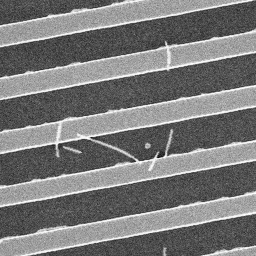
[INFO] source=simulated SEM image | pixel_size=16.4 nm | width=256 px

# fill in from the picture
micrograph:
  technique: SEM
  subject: lines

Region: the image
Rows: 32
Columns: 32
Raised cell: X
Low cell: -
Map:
---------------XXXXXXXXXXXXXX---
---------XXXXXXXXXXXXXXX--------
----XXXXXXXXXXXXXX--------------
XXXXXXXXXXXX--------------------
XXXXXXX---------------------XXXX
XX---------------------XXXXXXXXX
------------------XXXXXXXXXXXXXX
------------XXXXXXXXXXXXXXX-----
-------XXXXXXXXXXXXXXX----------
--XXXXXXXXXXXXXX----------------
XXXXXXXXXXX---------------------
XXXXX----------------------XXXXX
----------------------XXXXXXXXXX
----------------XXXXXXXXXXXXXXX-
-----------XXXXXXXXXXXXXX-------
-----XXXXXXXXXXXXXXX------------
XXXXXXXXXXXXXXX-----------------
XXXXXXXXX-----------------------
XXXX-----------------------XXXXX
----------------------XXXXXXXXXX
----------------XXXXXXXXXXXXXX--
-----------XXXXXXXXXXXXX--------
-----XXXXXXXXXXXXX--------------
XXXXXXXXXXXXX-------------------
XXXXXXXX----------------------XX
XX----------------------XXXXXXXX
-------------------XXXXXXXXXXXXX
--------------XXXXXXXXXXXXX-----
--------XXXXXXXXXXXXXX----------
---XXXXXXXXXXXXXX---------------
XXXXXXXXXXX---------------------
XXXXXX----------------------XXXX